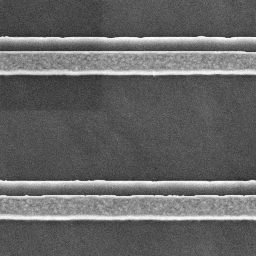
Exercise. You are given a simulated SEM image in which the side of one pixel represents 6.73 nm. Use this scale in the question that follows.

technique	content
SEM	lines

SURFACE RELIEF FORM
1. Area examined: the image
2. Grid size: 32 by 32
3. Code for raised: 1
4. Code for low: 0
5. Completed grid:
00000000000000000000000000000000
00000000000000000000000000000000
00000000000000000000000000000000
00000000000000000000000000000000
00000000000000000000000000000000
11111111111111111111111111111111
11111111111111111111111111111111
11111111111111111111111111111111
11111111111111111111111111111111
00000000000000000000000000000000
00000000000000000000000000000000
00000000000000000000000000000000
00000000000000000000000000000000
00000000000000000000000000000000
00000000000000000000000000000000
00000000000000000000000000000000
00000000000000000000000000000000
00000000000000000000000000000000
00000000000000000000000000000000
00000000000000000000000000000000
00000000000000000000000000000000
00000000000000000000000000000000
00000000000000000000000000000000
11111111111111111111111111111111
11111111111111111111111111111111
11111111111111111111111111111111
11111111111111111111111111111111
00000000000000000000000000000000
00000000000000000000000000000000
00000000000000000000000000000000
00000000000000000000000000000000
00000000000000000000000000000000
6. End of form